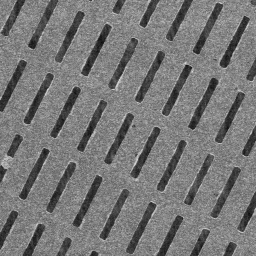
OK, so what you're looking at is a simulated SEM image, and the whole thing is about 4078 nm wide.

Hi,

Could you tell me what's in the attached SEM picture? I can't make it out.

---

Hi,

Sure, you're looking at a regular array of holes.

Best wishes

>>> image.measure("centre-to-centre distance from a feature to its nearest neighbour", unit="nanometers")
476